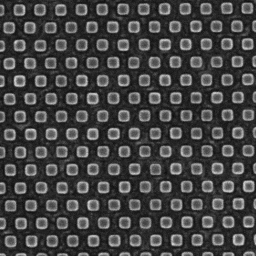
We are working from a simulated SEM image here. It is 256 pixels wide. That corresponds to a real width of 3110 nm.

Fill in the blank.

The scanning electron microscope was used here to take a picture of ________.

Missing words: a regular array of raised bodies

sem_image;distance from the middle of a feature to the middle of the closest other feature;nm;246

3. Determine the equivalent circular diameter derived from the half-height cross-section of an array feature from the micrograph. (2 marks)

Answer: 142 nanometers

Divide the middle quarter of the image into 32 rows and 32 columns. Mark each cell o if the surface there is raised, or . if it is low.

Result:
.oo...oo...ooo..ooo...oo...oo...
................................
................................
o..ooo..ooo...oo...oo...ooo..ooo
o..ooo..ooo...oo...oo...ooo..ooo
................................
................................
.oo...oo...oo....o....oo...oo...
.oo...oo...ooo..ooo...oo...oo...
.oo...oo...oo....oo...oo...oo...
................................
................................
o..ooo..ooo...oo...oo...ooo..ooo
o..ooo..ooo...oo...oo...ooo..ooo
................................
................................
.oo...ooo..ooo..ooo...oo...oo...
.oo...ooo..ooo..ooo...oo...oo...
.oo...ooo..ooo...oo...oo........
................................
................................
o..ooo...oo...oo...oo...ooo..ooo
o..ooo...oo...oo...oo...ooo..ooo
................................
................................
.oo...oo...ooo..ooo...oo...oo...
.oo...ooo..ooo..ooo...oo...oo...
.oo...oo...ooo...oo...oo...o....
................................
...................oo...oo....oo
o..ooo...oo...oo...ooo..ooo..ooo
o...oo...oo...oo...ooo..ooo..ooo